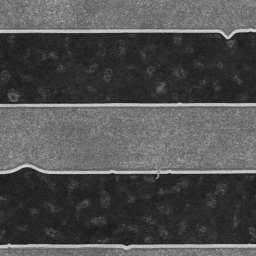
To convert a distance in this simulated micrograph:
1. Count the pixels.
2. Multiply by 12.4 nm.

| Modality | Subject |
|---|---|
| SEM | one or a few lines or trenches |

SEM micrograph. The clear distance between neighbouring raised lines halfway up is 0.916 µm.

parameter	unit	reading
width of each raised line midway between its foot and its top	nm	835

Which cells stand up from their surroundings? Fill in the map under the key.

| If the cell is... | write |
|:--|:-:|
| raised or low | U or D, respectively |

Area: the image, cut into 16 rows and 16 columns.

UUUUUUUUUUUUUUUU
UUUUUUUUUUUUUUUU
DDDDDDDDDDDDDDDD
DDDDDDDDDDDDDDDD
DDDDDDDDDDDDDDDD
DDDDDDDDDDDDDDDD
DDDDDDDDDDDDDDDD
UUUUUUUUUUUUUUUU
UUUUUUUUUUUUUUUU
UUUUUUUUUUUUUUUU
UDUUUUUUUUUUUUUU
DDDDDDDDDDDDDDDD
DDDDDDDDDDDDDDDD
DDDDDDDDDDDDDDDD
DDDDDDDDDDDDDDDD
UUUUUUUUUUUUUUUU